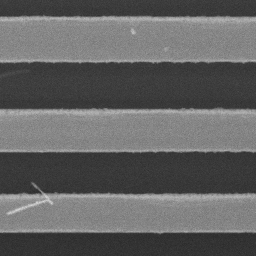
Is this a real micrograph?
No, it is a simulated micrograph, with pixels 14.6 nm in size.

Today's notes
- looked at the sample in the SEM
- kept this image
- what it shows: lines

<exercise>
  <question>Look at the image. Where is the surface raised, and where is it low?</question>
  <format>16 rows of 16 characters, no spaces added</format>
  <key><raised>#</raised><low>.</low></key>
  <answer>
................
################
################
################
................
................
................
################
################
................
................
................
################
################
################
................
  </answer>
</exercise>